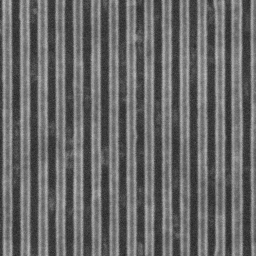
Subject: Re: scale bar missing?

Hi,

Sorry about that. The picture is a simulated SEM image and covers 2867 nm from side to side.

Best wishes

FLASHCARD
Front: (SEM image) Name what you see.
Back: parallel lines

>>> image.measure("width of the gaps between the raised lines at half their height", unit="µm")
0.122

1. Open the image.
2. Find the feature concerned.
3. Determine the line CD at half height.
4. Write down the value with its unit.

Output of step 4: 78.4 nanometers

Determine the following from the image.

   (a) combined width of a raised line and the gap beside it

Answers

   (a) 198 nanometres